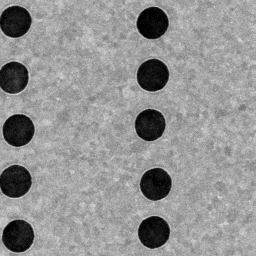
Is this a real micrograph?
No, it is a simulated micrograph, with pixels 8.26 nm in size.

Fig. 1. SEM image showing holes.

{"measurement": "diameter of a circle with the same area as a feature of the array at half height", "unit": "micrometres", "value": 0.272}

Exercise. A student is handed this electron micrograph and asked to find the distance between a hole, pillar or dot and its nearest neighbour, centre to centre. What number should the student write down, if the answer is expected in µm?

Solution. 0.408